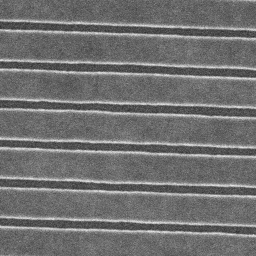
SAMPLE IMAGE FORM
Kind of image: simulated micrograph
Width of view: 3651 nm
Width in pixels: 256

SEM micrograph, parallel lines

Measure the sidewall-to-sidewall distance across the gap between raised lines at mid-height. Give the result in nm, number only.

125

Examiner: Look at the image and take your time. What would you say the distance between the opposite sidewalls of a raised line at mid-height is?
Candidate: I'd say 436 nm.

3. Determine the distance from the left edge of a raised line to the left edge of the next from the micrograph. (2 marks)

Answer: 561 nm